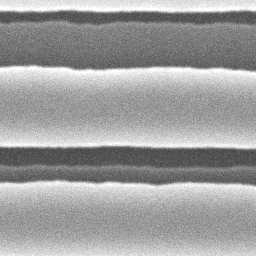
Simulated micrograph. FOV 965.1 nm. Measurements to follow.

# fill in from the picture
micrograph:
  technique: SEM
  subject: lines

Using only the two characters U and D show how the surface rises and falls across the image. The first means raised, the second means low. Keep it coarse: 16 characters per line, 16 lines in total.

UUUUUUUUUUUUUUUU
DDDDDDDDDDDDDDDD
DDDDDDDDDDDDDDDD
DDDDDDDDDDDDDDDD
UUUUUUUUUUUUUUUU
UUUUUUUUUUUUUUUU
UUUUUUUUUUUUUUUU
UUUUUUUUUUUUUUUU
UUUUUUUUUUUUUUUU
DDDDDDDDDDDDDDDD
DDDDDDDDDDDDDDDD
UUUUUUUUDDDUDDDD
UUUUUUUUUUUUUUUU
UUUUUUUUUUUUUUUU
UUUUUUUUUUUUUUUU
UUUUUUUUUUUUUUUU